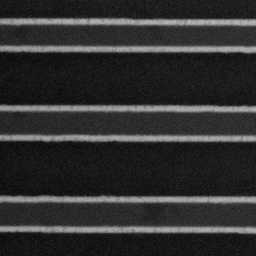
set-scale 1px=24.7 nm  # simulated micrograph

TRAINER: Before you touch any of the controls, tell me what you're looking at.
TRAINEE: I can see lines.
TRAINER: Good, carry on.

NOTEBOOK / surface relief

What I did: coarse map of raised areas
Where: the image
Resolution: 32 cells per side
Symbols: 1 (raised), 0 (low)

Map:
00000000000000000000000000000000
00000000000000000000000000000000
00000000000000000000000000000000
11111111111111111111111111111111
11111111111111111111111111111111
11111111111111111111111111111111
00000000000000000000000000000000
00000000000000000000000000000000
00000000000000000000000000000000
00000000000000000000000000000000
00000000000000000000000000000000
00000000000000000000000000000000
00000000000000000000000000000000
11111111111111111111111111111111
11111111111111111111111111111111
11111111111111111111111111111111
11111111111111111111111111111111
00000000000000000000000000000001
00000000000000000000000000000000
00000000000000000000000000000000
00000000000000000000000000000000
00000000000000000000000000000000
00000000000000000000000000000000
00000000000000000000000000000000
00000000000000000000000000000000
11111111111111111111111111111111
11111111111111111111111111111111
11111111111111111111111111111111
11111111111111111111111111111111
00000000000000000000000000000000
00000000000000000000000000000000
00000000000000000000000000000000